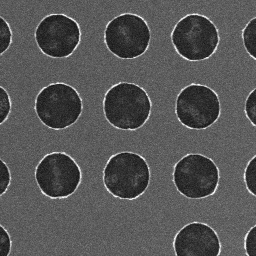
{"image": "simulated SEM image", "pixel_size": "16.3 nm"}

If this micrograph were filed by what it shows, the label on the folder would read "a regular array of holes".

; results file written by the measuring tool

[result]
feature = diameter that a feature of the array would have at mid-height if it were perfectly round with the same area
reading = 726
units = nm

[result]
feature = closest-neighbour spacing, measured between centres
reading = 1120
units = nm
